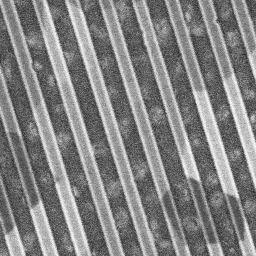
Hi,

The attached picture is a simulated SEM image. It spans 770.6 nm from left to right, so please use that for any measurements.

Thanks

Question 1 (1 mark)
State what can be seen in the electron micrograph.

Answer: parallel lines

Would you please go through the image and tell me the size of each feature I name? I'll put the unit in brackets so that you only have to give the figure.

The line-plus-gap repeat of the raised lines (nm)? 95.5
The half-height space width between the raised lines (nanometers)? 62.3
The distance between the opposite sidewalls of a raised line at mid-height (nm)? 32.7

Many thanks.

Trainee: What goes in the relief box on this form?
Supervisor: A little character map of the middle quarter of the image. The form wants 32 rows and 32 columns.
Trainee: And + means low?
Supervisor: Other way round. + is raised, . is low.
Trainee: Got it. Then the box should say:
......+++.....+++.....+++......+
+.....+++.....+++......++......+
+.....+++.....++++.....+++.....+
+......+++.....+++.....+++.....+
++.....+++.....+++......++......
++.....+++.....+++......+++.....
++.....++++.....+++.....+++.....
+++.....+++.....+++.....+++.....
+++.....+++.....+++......+++....
+++.....+++......+++.....+++....
+++......+++.....+++.....+++....
.+++.....+++.....+++......+++...
.+++.....+++......+++.....+++...
.+++......+++.....+++.....+++...
..+++.....+++.....+++......++...
..+++.....+++.....++++.....+++..
..+++.....++++.....+++.....+++..
...+++.....+++.....+++......++..
...+++.....+++.....+++......+++.
...+++.....+++......+++.....+++.
...++++.....+++.....+++.....+++.
....+++.....+++.....+++......+++
....+++.....+++......+++.....+++
....+++......+++.....+++.....+++
.....+++.....+++.....+++......++
.....+++.....+++.....++++.....++
.....+++......+++.....+++.....++
......+++.....+++.....+++......+
+.....+++.....+++.....+++......+
+.....+++.....+++......+++.....+
+......+++.....+++.....+++......
++.....+++.....+++.....+++......